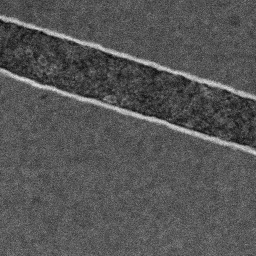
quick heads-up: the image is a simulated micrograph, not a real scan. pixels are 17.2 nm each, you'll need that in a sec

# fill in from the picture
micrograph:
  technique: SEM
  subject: one or a few lines or trenches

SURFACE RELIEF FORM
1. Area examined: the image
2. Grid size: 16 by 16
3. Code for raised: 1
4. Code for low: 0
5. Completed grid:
1111111111111111
0111111111111111
0000011111111111
0000000011111111
0000000000011111
1110000000000011
1111110000000000
1111111111000000
1111111111111000
1111111111111111
1111111111111111
1111111111111111
1111111111111111
1111111111111111
1111111111111111
1111111111111111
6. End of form